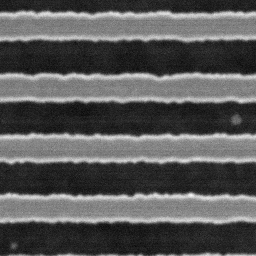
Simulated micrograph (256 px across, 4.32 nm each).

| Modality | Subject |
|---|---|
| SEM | lines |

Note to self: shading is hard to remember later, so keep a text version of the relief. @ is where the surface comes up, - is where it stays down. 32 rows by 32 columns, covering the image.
--------------------------------
--------------------@-----------
@@@@@@@@@@@@@@@@@@@@@@@@@@@@@@@@
@@@@@@@@@@@@@@@@@@@@@@@@@@@@@@@@
@@@@@@@@@@@@@@@@@@@@@@@@@@@@@@@@
--------------------------------
--------------------------------
--------------------------------
--------------------------------
@@@@@@@@@@@@@@@@@@@--@@@@@@@@@@@
@@@@@@@@@@@@@@@@@@@@@@@@@@@@@@@@
@@@@@@@@@@@@@@@@@@@@@@@@@@@@@@@@
@@@@@@@@@@@@@@@@@@@@@@@@@@@@@@@@
--------------------------------
--------------------------------
--------------------------------
--------------------------------
@@@@@@@@@@@@@@@@@@@@@@@@@@@@@@@@
@@@@@@@@@@@@@@@@@@@@@@@@@@@@@@@@
@@@@@@@@@@@@@@@@@@@@@@@@@@@@@@@@
--------------------------------
--------------------------------
--------------------------------
--------------------------------
@@@@@-@@@---@--@-@@@@@@@@--@@-@-
@@@@@@@@@@@@@@@@@@@@@@@@@@@@@@@@
@@@@@@@@@@@@@@@@@@@@@@@@@@@@@@@@
@@@@@@@@@@@@@@@@@@@@@@@@@@@@@@@@
--------------------------------
--------------------------------
--------------------------------
--------------------------------